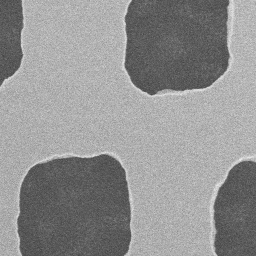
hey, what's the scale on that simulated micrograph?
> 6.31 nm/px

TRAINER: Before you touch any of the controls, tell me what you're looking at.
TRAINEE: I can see holes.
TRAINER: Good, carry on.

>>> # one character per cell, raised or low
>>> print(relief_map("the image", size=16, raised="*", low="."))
.*******......**
.*******......**
.*******......**
.*******......**
.*******......**
*********....***
****************
****************
****************
****************
**......*******.
*.......******..
*.......*****...
*.......*****...
*.......*****...
*.......*****...